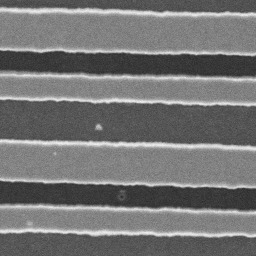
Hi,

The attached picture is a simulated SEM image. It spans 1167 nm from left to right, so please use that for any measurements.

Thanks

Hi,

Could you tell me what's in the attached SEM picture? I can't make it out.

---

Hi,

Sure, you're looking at lines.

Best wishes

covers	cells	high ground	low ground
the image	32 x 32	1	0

00000000000000000000000000000000
11111111111111111000000000000000
11111111111111111111111111111111
11111111111111111111111111111111
11111111111111111111111111111111
11111111111111111111111111111111
00000000000100001111111111111111
00000000000000000000000000000000
00000000000000000000000000000000
11111111111000000000000000000000
11111111111111111111111111111111
11111111111111111111111111111111
00000000111111111111111111111111
00000000000000000000000000000000
00000000000000000000000000000000
00000000000000000000000000000000
00000000000000000000000000000000
00000000000000000000000000000000
11111111111111111111111111111111
11111111111111111111111111111111
11111111111111111111111111111111
11111111111111111111111111111111
11111111111111111111111111111111
00000000000000000000000000001100
00000000000000000000000000000000
00000000000000000000000000000000
11111111111111111111111111111100
11111111111111111111111111111111
11111111111111111111111111111111
00000000000000000000000000000000
00000000000000000000000000000000
00000000000000000000000000000000